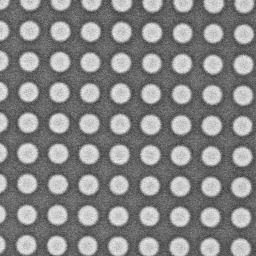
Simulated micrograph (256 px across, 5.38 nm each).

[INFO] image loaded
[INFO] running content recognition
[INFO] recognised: an array of small figures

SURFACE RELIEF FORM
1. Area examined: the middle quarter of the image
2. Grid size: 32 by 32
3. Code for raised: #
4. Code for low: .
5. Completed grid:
#...#####...####....####...#####
.....###.....###....###.....###.
................................
................................
................................
#....###.....###.....##......#..
#...#####...####....####...####.
#...#####...####....####...#####
#....###....####....####...####.
.............##......##.....###.
................................
................................
................................
#...####....####....###.....###.
#...#####...####...#####...####.
#...#####...####...#####...#####
.....###....####....####...####.
................................
................................
................................
.....##......##......#..........
#...####....####....####...####.
#...#####...####...#####...####.
#...####....####...#####...####.
.....##.....###.....###....####.
................................
................................
................................
.....###....###.....##......##..
#...####....####...####....####.
#...####....####...#####...####.
....####....####...#####...####.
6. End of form